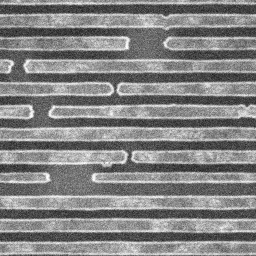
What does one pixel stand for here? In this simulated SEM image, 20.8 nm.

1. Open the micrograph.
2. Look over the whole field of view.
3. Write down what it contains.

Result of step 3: parallel lines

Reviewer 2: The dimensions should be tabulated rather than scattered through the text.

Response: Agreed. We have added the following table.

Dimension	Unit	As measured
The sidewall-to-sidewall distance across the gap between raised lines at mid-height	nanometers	219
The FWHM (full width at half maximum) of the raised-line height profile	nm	258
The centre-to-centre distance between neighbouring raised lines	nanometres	474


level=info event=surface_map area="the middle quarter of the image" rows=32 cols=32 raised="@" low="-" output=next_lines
@@@@@@@@@@@@@@@@@@@@@@@@@@@@@@@@
@@@@@@@@@@@@@@@@@@@@@@@@@@@@@@@@
--------------------------------
--------------------------------
--------------------------------
@@@@@@@@@@@@--@@@@@@@@@@@@@@@@@@
@@@@@@@@@@@@--@@@@@@@@@@@@@@@@@@
--@@@@@@@@@-----------------@@@@
--------------------------------
--------------------------------
--------------------------@@@---
@@@@@@@@@@@@@@@@@@@@@@@@@@@@@@@@
@@@@@@@@@@@@@@@@@@@@@@@@@@@@@@@@
--------------------------------
--------------------------------
--------------------------------
@@@@@@@@@@@@@@@@@@@@@@@@@@@@@@@@
@@@@@@@@@@@@@@@@@@@@@@@@@@@@@@@@
@@@@@@@@@@@@@@@@@@@@@@@@@@@@@@@@
--------------------------------
--------------------------------
--------------------------------
@@@@@@@@@@@@@@@@-@@@@@@@@@@@@@@@
@@@@@@@@@@@@@@@--@@@@@@@@@@@@@@@
@@@@@@@@@@@@@@@---@-@@@@@@@@@@@@
--------------------------------
--------------------------------
--------@@@@@@@@@@@@@@@@@@@@@@@@
-------@@@@@@@@@@@@@@@@@@@@@@@@@
-----------------------------@@@
--------------------------------
--------------------------------